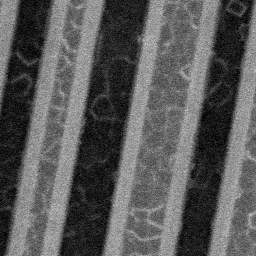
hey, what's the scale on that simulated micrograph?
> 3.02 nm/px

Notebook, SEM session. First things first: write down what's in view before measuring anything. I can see one or a few lines or trenches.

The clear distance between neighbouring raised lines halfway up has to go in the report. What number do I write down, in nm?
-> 153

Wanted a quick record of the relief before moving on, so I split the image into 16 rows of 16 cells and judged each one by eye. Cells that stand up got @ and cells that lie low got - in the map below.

@---@@----@@@---
----@@----@@@---
---@@@---@@@@---
---@@----@@@@---
---@@----@@@----
---@@----@@@---@
---@@----@@@---@
--@@@---@@@@---@
--@@----@@@@---@
--@@----@@@@---@
--@@----@@@----@
--@@----@@@---@@
--@@----@@@---@@
-@@@---@@@@---@@
-@@----@@@@---@@
-@@----@@@----@@